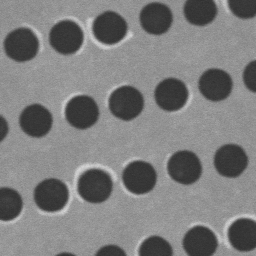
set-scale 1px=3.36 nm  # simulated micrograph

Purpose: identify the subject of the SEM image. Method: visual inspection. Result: a regular array of holes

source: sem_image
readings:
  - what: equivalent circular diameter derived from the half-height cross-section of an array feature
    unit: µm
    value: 0.118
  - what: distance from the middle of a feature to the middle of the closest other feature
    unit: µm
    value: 0.152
